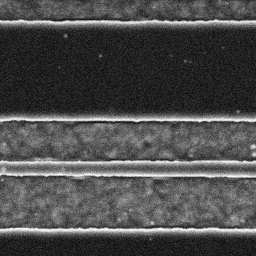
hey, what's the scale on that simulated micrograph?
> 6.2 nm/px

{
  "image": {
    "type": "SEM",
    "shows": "lines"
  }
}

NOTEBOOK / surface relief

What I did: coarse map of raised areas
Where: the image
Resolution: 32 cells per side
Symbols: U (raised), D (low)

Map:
DDDDDDDDDDDDDDDDDDDDDDDDDDDDDDDD
DDDDDDDDDDDDDDDDDDDDDDDDDDDDDDDD
DDDDDDDDDDDDDDDDDDDDDDDDDDDDDDDD
UUUUUUUUUUUUUUUUUUUUUUUUUUUUUUUU
UUUUUUUUUUUUUUUUUUUUUUUUUUUUUUUU
UUUUUUUUUUUUUUUUUUUUUUUUUUUUUUUU
UUUUUUUUUUUUUUUUUUUUUUUUUUUUUUUU
UUUUUUUUUUUUUUUUUUUUUUUUUUUUUUUU
UUUUUUUUUUUUUUUUUUUUUUUUUUUUUUUU
UUUUUUUUUUUUUUUUUUUUUUUUUUUUUUUU
UUUUUUUUUUUUUUUUUUUUUUUUUUUUUUUU
UUUUUUUUUUUUUUUUUUUUUUUUUUUUUUUU
UUUUUUUUUUUUUUUUUUUUUUUUUUUUUUUU
UUUUUUUUUUUUUUUUUUUUUUUUUUUUUUUU
UUUUUUUUUUUUUUUUUUUUUUUUUUUUUUUU
DDDDDDDDDDDDDDDDDDDDDDDDDDDDDDDD
DDDDDDDDDDDDDDDDDDDDDDDDDDDDDDDD
DDDDDDDDDDDDDDDDDDDDDDDDDDDDDDDD
DDDDDDDDDDDDDDDDDDDDDDDDDDDDDDDD
DDDDDDDDDDDDDDDDDDDDDDDDDDDDDDDD
UUUUUUUUUUUUUUUUUUUUUUUUUUUUUUUU
UUUUUUUUUUUUUUUUUUUUUUUUUUUUUUUU
DDDDDDDDDDDDDDDDDDDDDDDDDDDDDDDD
DDDDDDDDDDDDDDDDDDDDDDDDDDDDDDDD
DDDDDDDDDDDDDDDDDDDDDDDDDDDDDDDD
DDDDDDDDDDDDDDDDDDDDDDDDDDDDDDDD
DDDDDDDDDDDDDDDDDDDDDDDDDDDDDDDD
DDDDDDDDDDDDDDDDDDDDDDDDDDDDDDDD
DDDDDDDDDDDDDDDDDDDDDDDDDDDDDDDD
UUUUUUUUUUUUUUUUUUUUUUUUUUUUUUUU
UUUUUUUUUUUUUUUUUUUUUUUUUUUUUUUU
UUUUUUUUUUUUUUUUUUUUUUUUUUUUUUUU